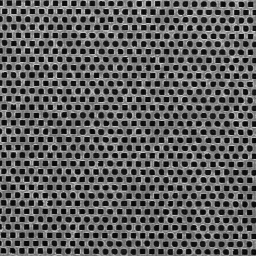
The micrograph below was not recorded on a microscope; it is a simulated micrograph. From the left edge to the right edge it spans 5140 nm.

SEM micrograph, a regular array of holes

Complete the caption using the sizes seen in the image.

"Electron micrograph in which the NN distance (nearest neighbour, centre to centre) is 8.84 px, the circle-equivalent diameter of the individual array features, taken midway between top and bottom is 124 nm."